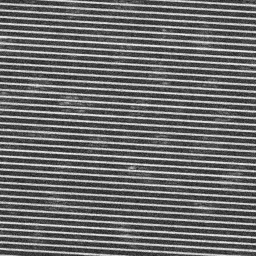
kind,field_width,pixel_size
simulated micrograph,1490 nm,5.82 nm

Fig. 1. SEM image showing parallel lines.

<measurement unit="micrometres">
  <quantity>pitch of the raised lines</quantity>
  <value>0.0385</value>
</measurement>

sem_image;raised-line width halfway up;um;0.0087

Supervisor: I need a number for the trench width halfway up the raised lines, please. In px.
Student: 4.86